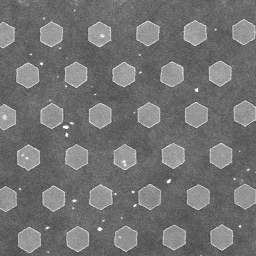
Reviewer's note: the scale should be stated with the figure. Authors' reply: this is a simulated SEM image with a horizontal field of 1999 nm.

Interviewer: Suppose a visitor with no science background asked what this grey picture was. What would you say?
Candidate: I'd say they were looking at a regular array of raised bodies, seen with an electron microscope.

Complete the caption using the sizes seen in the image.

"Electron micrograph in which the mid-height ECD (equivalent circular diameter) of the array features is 183 nanometres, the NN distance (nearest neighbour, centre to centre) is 367 nm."